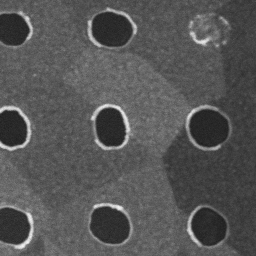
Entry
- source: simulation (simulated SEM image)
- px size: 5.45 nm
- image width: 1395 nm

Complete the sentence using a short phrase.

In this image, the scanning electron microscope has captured holes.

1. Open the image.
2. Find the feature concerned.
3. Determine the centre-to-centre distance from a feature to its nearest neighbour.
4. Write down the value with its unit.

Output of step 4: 0.534 µm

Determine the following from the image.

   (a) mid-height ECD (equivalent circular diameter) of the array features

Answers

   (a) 213 nm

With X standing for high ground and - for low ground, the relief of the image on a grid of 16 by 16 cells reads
XXXXXXXXXXXXXXXX
--XXXX--XXXXXXXX
--XXXX--XXXXXXXX
XXXXXXXXXXXXXXXX
XXXXXXXXXXXXXXXX
XXXXXXXXXXXXXXXX
XXXXXXXXXXXXXXXX
-XXXXX--XXXX--XX
--XXXX--XXXX--XX
XXXXXXXXXXXXXXXX
XXXXXXXXXXXXXXXX
XXXXXXXXXXXXXXXX
XXXXXXXXXXXXXXXX
--XXXX--XXXX--XX
--XXXX--XXXX--XX
XXXXXXXXXXXXXXXX